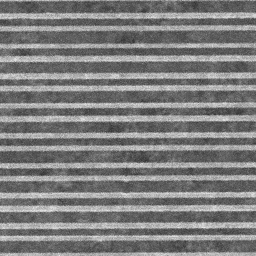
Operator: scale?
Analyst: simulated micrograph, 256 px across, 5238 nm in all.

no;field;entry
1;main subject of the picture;parallel lines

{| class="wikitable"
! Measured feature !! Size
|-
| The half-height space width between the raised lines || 240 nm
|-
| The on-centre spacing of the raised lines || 14.8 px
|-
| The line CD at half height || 92.1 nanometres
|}